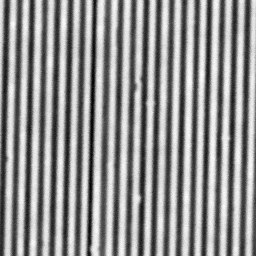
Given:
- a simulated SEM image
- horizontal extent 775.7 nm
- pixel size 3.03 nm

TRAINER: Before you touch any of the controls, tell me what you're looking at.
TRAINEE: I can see parallel lines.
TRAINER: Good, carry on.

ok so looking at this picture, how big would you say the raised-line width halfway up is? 19.7 nm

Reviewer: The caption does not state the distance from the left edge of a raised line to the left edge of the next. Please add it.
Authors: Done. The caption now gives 0.0384 µm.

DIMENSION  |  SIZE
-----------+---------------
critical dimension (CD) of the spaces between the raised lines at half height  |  17 nanometres